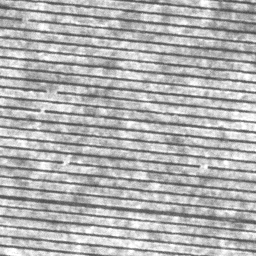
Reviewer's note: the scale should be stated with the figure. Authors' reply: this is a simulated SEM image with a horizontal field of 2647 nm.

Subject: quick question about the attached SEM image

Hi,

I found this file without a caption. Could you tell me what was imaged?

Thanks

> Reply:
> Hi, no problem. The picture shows parallel lines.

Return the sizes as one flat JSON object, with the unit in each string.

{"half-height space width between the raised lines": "34.7 nm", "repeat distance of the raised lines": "102 nm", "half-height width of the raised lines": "0.0643 um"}